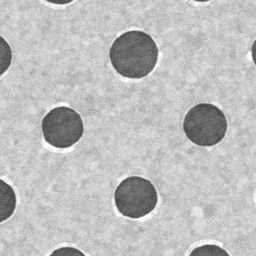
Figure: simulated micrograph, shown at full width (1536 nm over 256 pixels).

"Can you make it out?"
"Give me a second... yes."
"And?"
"holes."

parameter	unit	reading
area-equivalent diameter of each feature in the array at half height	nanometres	264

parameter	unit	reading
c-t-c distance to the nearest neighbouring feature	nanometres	602